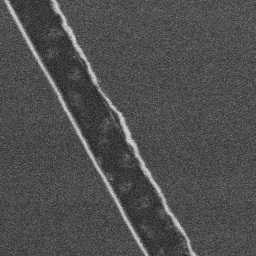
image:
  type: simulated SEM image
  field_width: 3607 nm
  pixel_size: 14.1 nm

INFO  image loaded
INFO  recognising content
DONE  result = one or a few lines or trenches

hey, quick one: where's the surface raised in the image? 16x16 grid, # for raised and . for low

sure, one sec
#...############
#...############
##...###########
##...###########
###...##########
###...##########
####...#########
####....########
#####...########
######...#######
######...#######
#######...######
#######...######
########...#####
########...#####
#########...####